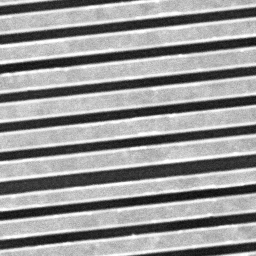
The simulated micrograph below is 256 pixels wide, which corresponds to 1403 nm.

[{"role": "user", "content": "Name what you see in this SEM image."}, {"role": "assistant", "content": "parallel lines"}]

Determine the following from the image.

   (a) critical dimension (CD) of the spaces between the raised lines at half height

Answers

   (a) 64.7 nanometers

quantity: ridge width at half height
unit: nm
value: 91.3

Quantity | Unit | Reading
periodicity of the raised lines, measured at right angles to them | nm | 160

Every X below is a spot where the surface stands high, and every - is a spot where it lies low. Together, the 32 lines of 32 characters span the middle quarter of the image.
-------XXXXXXXXXXXXXXXXXXXXXXXXX
XXXXXXXXXXXXXXXXXXXXXXXXXXXXXXXX
XXXXXXXXXXXXXXXXXXXXXXXXX-------
XXXXXXXXXXXXXXXXXX--------------
XXXXXXX-------------------------
--------------------------XX-XXX
-----------------X-XXXXXXXXXXXXX
----------XXXXXXXXXXXXXXXXXXXXXX
-XXXXXXXXXXXXXXXXXXXXXXXXXXXXXXX
XXXXXXXXXXXXXXXXXXXXXXXXXXXXX---
XXXXXXXXXXXXXXXXXXXX------------
XXXXXXXXXXX---------------------
X-----------------------------XX
-------------------XXXXXXXXXXXXX
------------XXXXXXXXXXXXXXXXXXXX
--XXXXXXXXXXXXXXXXXXXXXXXXXXXXXX
XXXXXXXXXXXXXXXXXXXXXXXXXXXXXXXX
XXXXXXXXXXXXXXXXXXXXXXX---------
XXXXXXXXXXXXXX------------------
XXXXX---------------------------
-------------------------XXXXXXX
---------------XXXXXXXXXXXXXXXXX
------XXXXXXXXXXXXXXXXXXXXXXXXXX
XXXXXXXXXXXXXXXXXXXXXXXXXXXXXXXX
XXXXXXXXXXXXXXXXXXXXXXXXX-------
XXXXXXXXXXXXXXXX----------------
XXXXXX--------------------------
--------------------------------
----------------------------XXXX
-------------------XXXXXXXXXXXXX
-------XXXXXXXXXXXXXXXXXXXXXXXXX
-XXXXXXXXXXXXXXXXXXXXXXXXXXXXXX-